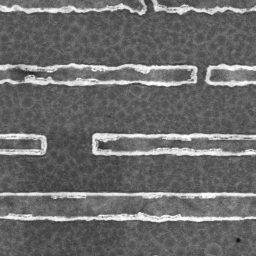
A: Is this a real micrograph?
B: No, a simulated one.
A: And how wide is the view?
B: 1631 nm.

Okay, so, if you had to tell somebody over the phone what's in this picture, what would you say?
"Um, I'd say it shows one or a few lines or trenches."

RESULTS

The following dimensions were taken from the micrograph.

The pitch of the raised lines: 418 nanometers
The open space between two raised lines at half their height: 332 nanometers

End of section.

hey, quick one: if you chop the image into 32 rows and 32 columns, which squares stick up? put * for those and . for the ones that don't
******************.*************
..........*......*...**...*.....
................................
................................
................................
................................
................................
................................
*****.********.*********..******
************************..******
........*.........*****....***..
................................
................................
................................
................................
................................
................................
******......********************
******......********************
................................
................................
................................
................................
................................
********************************
********************************
********************************
..................****..**......
................................
................................
................................
..........................*.....